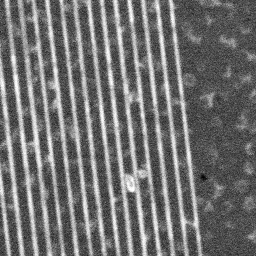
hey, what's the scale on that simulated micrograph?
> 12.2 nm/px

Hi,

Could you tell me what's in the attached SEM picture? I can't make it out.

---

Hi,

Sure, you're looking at parallel lines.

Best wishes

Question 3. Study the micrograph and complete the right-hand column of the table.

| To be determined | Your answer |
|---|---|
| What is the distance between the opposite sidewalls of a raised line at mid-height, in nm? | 27.4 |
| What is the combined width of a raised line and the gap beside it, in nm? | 166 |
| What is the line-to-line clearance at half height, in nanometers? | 146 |